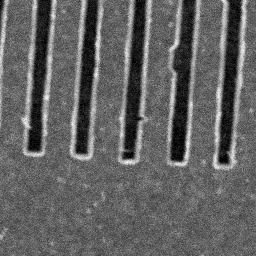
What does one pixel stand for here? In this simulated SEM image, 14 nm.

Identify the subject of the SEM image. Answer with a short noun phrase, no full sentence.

parallel lines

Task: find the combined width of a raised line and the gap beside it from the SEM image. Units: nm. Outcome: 668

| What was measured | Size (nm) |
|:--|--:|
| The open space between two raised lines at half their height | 235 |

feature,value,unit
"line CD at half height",430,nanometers